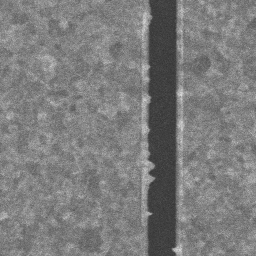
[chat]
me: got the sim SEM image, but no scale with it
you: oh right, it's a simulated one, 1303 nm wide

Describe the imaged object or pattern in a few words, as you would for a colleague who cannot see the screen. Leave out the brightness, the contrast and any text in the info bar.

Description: one or a few lines or trenches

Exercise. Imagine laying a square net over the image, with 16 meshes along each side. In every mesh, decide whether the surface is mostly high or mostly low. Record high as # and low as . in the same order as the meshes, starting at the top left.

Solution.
#########..#####
#########..#####
#########..#####
#########..#####
#########..#####
#########..#####
#########..#####
#########..#####
#########..#####
#########..#####
##########.#####
#########..#####
#########..#####
#########..#####
#########..#####
#########..#####